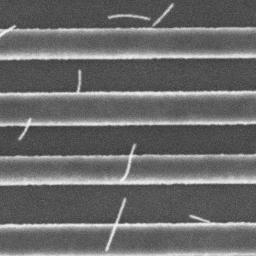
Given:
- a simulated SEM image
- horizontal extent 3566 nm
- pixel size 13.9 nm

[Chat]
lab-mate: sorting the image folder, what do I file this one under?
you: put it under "lines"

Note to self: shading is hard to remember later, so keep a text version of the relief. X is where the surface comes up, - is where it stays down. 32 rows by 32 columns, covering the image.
--------------------------------
--------------------------------
--------------------------------
--------------------------------
XXXXXXXXXXXXXXXXXXXXXXXXXXXXXXXX
XXXXXXXXXXXXXXXXXXXXXXXXXXXXXXXX
XXXXXXXXXXXXXXXXXXXXXXXXXXXXXXXX
--------------------------------
--------------------------------
--------------------------------
--------------------------------
------------------------------XX
XXXXXXXXXXXXXXXXXXXXXXXXXXXXXXXX
XXXXXXXXXXXXXXXXXXXXXXXXXXXXXXXX
XXXXXXXXXXXXXXXXXXXXXXXXXXXXXXXX
XXXXXXXXXXXXXXXXXXXXXXXXXXXX----
--------------------------------
--------------------------------
--------------------------------
---------------XXXXXXXXXXXXXXXXX
XXXXXXXXXXXXXXXXXXXXXXXXXXXXXXXX
XXXXXXXXXXXXXXXXXXXXXXXXXXXXXXXX
XXXXXXXXXXXXXXXXXXXXXXXXXXXXXXXX
--------------------------------
--------------------------------
--------------------------------
--------------------------------
--------------------------------
XXXXXXXXXXXXXXXXXXXXXXXXXXXXXXXX
XXXXXXXXXXXXXXXXXXXXXXXXXXXXXXXX
XXXXXXXXXXXXXXXXXXXXXXXXXXXXXXXX
XXXXXXXXXXXXXXXXXXXXXXXXXXXXXXXX